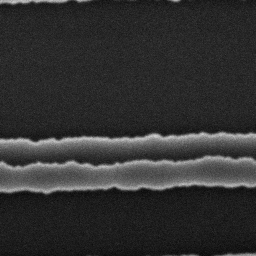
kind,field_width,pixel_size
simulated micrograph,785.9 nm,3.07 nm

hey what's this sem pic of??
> lines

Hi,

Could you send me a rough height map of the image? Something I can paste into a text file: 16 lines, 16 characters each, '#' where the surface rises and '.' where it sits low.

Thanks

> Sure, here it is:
................
................
................
................
................
................
................
................
.........#..####
################
################
################
................
................
................
................